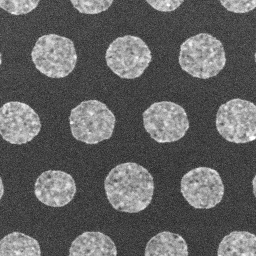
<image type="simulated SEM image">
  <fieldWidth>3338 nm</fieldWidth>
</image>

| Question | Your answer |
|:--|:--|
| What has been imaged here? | a regular array of raised bodies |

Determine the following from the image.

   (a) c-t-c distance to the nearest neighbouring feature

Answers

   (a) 963 nm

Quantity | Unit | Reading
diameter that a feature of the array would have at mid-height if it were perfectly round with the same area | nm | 561